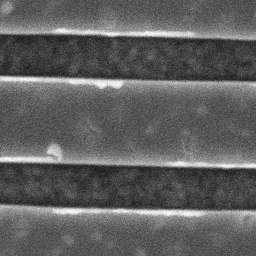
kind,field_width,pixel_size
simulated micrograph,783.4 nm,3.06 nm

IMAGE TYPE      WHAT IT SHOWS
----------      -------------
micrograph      one or a few lines or trenches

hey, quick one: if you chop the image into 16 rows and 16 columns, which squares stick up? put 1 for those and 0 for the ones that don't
1111111111111111
1111111111111111
0000000000000000
0000000000000000
0000000000000000
1111111111111111
1111111111111111
1111111111111111
1111111111111111
1111111111111111
0000000000000000
0000000000000000
0000000000000000
1111111111111111
1111111111111111
1111111111111111